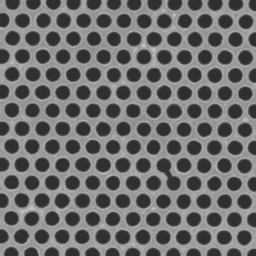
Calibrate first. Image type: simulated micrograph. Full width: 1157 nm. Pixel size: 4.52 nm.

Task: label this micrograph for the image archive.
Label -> a regular array of holes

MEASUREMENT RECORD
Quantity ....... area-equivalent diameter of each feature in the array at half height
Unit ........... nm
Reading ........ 61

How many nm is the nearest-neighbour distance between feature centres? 90.5